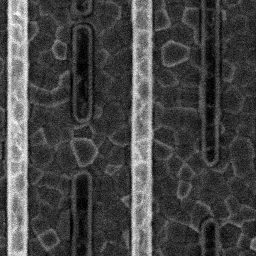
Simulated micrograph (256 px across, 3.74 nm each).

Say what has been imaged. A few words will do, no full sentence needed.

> one or a few lines or trenches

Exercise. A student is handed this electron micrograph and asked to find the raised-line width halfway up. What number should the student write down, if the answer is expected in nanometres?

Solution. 60.3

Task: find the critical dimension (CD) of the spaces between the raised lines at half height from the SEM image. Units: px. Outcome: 48.4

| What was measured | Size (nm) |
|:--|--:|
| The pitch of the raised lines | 238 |